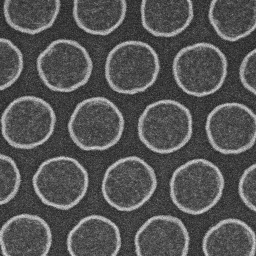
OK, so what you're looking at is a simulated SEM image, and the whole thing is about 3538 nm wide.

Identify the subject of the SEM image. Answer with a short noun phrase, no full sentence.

a regular array of raised bodies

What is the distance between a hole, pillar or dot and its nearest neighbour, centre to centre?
930 nanometres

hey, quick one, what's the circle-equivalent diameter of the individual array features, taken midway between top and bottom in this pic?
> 702 nanometres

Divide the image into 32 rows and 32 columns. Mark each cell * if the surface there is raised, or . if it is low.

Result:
.******..******...******...*****
.******..******...******..******
.******...*****...******..******
..***......***....*****....*****
............................**..
*......**......***..............
**....*****...*****....****.....
***..******...******..******...*
***..******..*******..******..**
**...******..******...******..**
*.....****....*****...******...*
.......................***......
..***......**...................
.*****....****.....****....****.
.******..******...******..******
*******..******...******..******
******...******...******..******
.*****...******...*****...******
...........*.......***.....****.
................................
**....****.....***......**......
**...******..******...*****....*
**..*******..******...******..**
**..*******..******..*******..**
*....*****...******...*****...**
......***.....****....*****....*
........................*.......
.****......**......***..........
******...*****....*****....****.
******...******..******...******
******...******..******...******
.*****...******..******...******